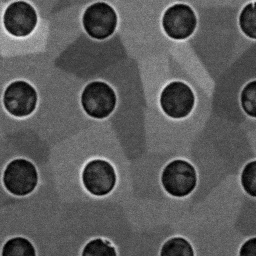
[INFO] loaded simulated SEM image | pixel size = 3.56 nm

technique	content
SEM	a regular array of holes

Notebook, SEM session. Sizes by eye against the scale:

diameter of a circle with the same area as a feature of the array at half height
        129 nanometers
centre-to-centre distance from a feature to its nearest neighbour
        0.279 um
